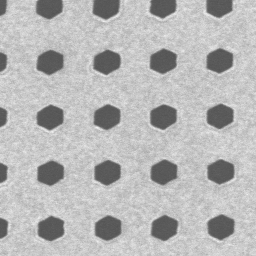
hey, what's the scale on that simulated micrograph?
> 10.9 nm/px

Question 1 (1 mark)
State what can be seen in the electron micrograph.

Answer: a regular array of holes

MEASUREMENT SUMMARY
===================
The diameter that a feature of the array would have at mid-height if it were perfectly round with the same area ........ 282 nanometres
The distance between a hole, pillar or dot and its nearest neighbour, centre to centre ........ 607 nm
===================